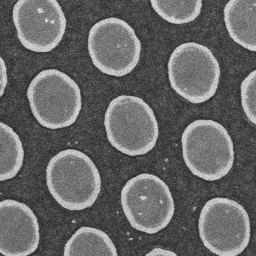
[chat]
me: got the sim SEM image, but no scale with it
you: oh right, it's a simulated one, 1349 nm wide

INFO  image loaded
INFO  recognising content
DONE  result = a regular array of raised bodies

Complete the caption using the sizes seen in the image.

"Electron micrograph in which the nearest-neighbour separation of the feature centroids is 417 nm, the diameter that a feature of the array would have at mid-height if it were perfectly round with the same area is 272 nm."